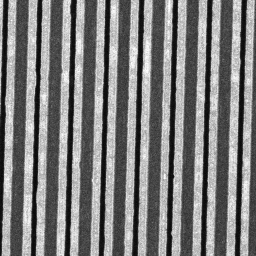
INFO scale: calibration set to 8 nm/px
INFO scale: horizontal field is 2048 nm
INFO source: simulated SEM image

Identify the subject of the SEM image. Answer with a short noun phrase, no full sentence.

parallel lines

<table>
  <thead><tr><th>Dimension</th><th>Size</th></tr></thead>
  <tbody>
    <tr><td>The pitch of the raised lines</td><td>0.136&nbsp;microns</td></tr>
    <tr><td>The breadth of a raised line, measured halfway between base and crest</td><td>67.9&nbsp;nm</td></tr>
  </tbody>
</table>